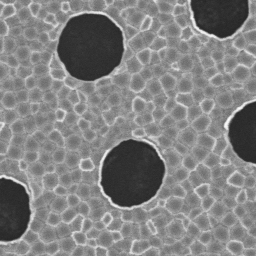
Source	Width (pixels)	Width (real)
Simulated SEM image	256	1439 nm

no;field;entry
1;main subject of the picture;holes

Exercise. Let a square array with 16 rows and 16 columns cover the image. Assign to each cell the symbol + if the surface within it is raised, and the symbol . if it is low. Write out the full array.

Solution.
++++++++++++....
++++...+++++...+
++++....++++++++
++++....++++++++
++++...+++++++++
++++++++++++++++
++++++++++++++++
++++++++++++++..
++++++++++++++..
+++++++...+++++.
++++++....++++++
.+++++....++++++
..+++++..+++++++
..++++++++++++++
..++++++++++++++
++++++++++++++++